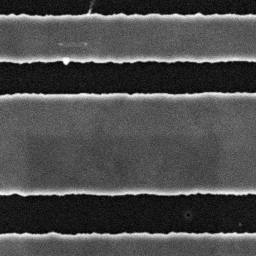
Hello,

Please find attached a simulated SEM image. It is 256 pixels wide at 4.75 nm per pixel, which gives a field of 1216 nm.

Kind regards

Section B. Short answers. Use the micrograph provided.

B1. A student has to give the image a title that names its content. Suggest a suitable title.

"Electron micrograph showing lines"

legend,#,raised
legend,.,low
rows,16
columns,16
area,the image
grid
................
################
################
################
................
................
################
################
################
################
################
################
................
................
................
################